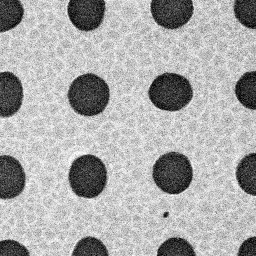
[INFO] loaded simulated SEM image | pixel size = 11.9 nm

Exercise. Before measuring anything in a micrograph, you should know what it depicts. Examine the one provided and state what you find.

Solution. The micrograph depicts holes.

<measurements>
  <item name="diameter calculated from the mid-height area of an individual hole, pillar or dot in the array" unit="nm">501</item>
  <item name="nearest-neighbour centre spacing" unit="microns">0.967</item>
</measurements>